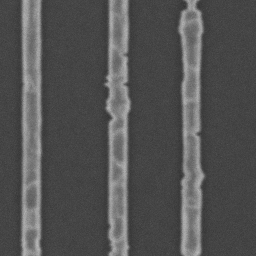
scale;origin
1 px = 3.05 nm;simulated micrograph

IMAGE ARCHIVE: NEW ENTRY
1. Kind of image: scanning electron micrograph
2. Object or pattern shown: one or a few lines or trenches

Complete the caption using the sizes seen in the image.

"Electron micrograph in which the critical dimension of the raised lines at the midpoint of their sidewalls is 46.1 nanometers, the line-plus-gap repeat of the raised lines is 244 nanometres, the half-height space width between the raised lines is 64.6 pixels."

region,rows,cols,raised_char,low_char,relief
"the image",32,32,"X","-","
---XX---------XX----------------
---XX---------XX-------XX-------
---XX---------XX-------XX-------
---XX---------XX-------XX-------
---XX---------XX-------XX-------
---XX---------XX-------XX-------
---XX---------XX-------XX-------
---XX---------XX-------XX-------
---XX---------XX-------XX-------
---XX---------XX-------XX-------
---XX---------XX-------XX-------
---XX---------XX-------XX-------
---XX---------XX-------XX-------
---XX---------XX-------XX-------
---XX---------XX-------XX-------
---XX---------XX-------XX-------
---XX---------XX-------XX-------
---XX---------XX-------XX-------
---XX---------XX-------XX-------
---XX---------XX-------XX-------
---XX---------XX-------XX-------
---XX---------XX-------XX-------
---XX---------XX-------XX-------
---XX---------XX-------XX-------
---XX---------XX-------XX-------
---XX---------XX-------XX-------
---XX---------XX-------XX-------
---XX---------XX-------XX-------
---XX---------XX-------XX-------
---XX---------XX-------XX-------
---XX---------XX-------XX-------
---XX---------XX-------XX-------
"